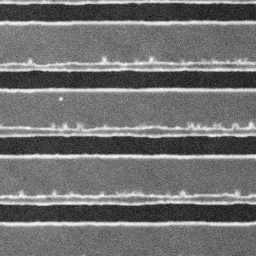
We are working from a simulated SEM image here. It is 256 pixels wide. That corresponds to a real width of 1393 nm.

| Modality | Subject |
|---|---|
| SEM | lines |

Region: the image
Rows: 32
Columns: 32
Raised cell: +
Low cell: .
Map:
................................
................................
................................
++++++++++++++++++++++++++++++++
++++++++++++++++++++++++++++++++
++++++++++++++++++++++++++++++++
++++++++++++++++++++++++++++++++
++++++++++++++++++++++++++++++++
++++++++++++++++++++++++++++++++
................................
................................
++++++++++++++++++++++++++++++++
++++++++++++++++++++++++++++++++
++++++++++++++++++++++++++++++++
++++++++++++++++++++++++++++++++
++++++++++++++++++++++++++++++++
++++++++++++++++++++++++++++++++
................................
................................
................................
++++++++++++++++++++++++++++++++
++++++++++++++++++++++++++++++++
++++++++++++++++++++++++++++++++
++++++++++++++++++++++++++++++++
++++++++++++++++++++++++++++++++
....++.........+++..............
................................
................................
++++++++++++++++++++++++++++++++
++++++++++++++++++++++++++++++++
++++++++++++++++++++++++++++++++
++++++++++++++++++++++++++++++++